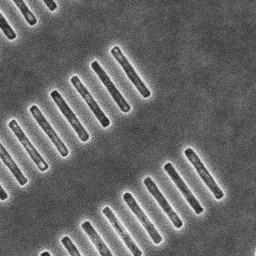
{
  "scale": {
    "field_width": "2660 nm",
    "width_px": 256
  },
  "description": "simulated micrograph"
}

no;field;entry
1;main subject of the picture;a regular array of holes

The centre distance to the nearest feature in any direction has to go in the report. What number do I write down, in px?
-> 25.1